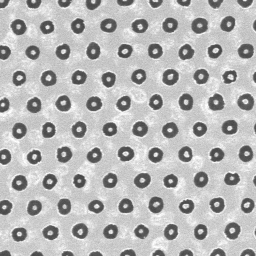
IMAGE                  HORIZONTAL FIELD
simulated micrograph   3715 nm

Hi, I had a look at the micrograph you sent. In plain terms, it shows a regular array of ring-shaped grooves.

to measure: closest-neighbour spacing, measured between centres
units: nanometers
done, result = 421